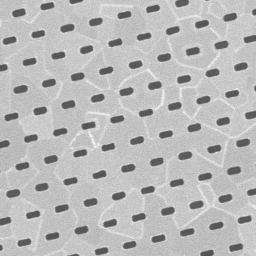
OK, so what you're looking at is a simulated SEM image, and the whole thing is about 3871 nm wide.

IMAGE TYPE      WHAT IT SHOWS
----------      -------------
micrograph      a regular array of holes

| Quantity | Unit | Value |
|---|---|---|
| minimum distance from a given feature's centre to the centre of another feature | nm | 435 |